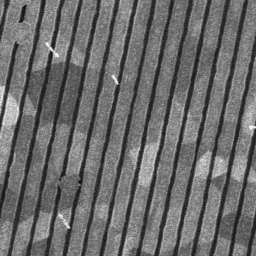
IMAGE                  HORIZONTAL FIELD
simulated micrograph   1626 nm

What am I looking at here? parallel lines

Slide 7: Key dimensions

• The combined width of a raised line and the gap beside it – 114 nm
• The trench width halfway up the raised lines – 30.3 nm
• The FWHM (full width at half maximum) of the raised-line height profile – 83.9 nm